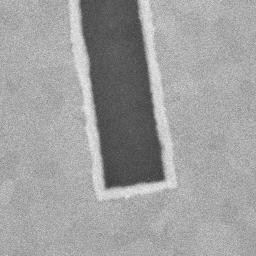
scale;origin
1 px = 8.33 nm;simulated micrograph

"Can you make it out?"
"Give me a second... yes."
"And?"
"one or a few lines or trenches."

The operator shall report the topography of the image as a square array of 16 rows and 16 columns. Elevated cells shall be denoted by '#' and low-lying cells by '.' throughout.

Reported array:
#####....#######
#####....#######
#####....#######
#####.....######
#####.....######
#####.....######
#####.....######
######....######
######....######
######.....#####
######.....#####
######....######
################
################
################
################